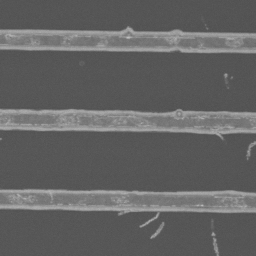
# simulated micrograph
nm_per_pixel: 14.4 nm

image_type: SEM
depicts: one or a few lines or trenches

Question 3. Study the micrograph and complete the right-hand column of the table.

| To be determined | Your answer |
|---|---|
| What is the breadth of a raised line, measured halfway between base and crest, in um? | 0.243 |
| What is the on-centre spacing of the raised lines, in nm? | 1150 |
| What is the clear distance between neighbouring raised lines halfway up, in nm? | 902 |